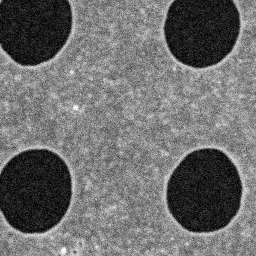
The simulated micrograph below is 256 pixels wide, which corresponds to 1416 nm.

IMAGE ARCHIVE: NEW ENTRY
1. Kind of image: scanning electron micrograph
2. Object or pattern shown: holes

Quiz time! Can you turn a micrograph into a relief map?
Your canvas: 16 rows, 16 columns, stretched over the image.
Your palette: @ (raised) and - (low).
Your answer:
----@@@@@@@----@
-----@@@@@-----@
----@@@@@@-----@
@--@@@@@@@@---@@
@@@@@@@@@@@@@@@@
@@@@@@@@@@@@@@@@
@@@@@@@@@@@@@@@@
@@@@@@@@@@@@@@@@
@@@@@@@@@@@@@@@@
@--@@@@@@@@@--@@
----@@@@@@@----@
----@@@@@@-----@
----@@@@@@-----@
----@@@@@@@----@
@--@@@@@@@@@-@@@
@@@@@@@@@@@@@@@@